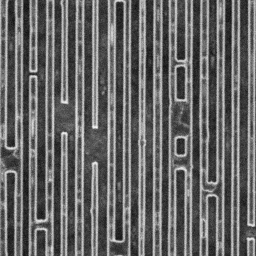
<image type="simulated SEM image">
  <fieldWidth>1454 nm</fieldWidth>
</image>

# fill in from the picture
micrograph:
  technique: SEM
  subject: parallel lines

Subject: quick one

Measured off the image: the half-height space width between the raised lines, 8.75 px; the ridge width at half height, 6.87 px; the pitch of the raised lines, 0.0881 micrometres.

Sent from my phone